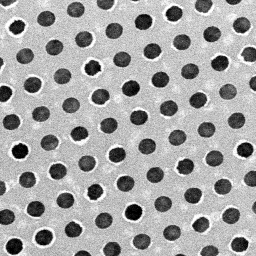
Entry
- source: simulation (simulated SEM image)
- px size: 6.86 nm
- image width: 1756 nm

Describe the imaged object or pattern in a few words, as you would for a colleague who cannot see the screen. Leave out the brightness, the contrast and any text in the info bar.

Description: a regular array of holes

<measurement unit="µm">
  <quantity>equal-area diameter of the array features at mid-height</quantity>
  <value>0.117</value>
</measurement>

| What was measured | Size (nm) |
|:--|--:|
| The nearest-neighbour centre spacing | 205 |